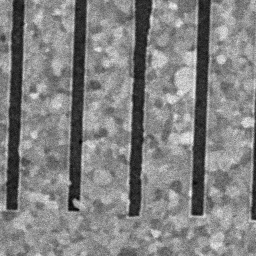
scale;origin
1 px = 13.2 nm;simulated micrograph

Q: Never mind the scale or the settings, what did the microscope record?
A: one or a few lines or trenches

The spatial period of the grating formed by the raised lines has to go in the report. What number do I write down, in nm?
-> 816